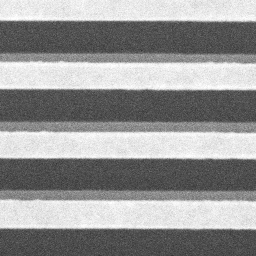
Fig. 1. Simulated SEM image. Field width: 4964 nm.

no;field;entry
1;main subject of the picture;lines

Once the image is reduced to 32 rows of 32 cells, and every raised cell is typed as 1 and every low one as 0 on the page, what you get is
11111111111111111111111111111111
11111111111111111111111111111111
11111111111111111111111111111111
00000000000000000000000000000000
00000000000000000000000000000000
00000000000000000000000000000000
00000000000000000000000000000000
11111111111111111111111111111111
11111111111111111111111111111111
11111111111111111111111111111111
11111111111111111111111111111111
00000000000000000000000000000000
00000000000000000000000000000000
00000000000000000000000000000000
00000000000000000000000000000000
11111111111111111111111111111111
11111111111111111111111111111111
11111111111111111111111111111111
11111111111111111111111111111111
11111111111111111111111111111111
00000000000000000000000000000000
00000000000000000000000000000000
00000000000000000000000000000000
00000000000000000000000000000000
11111111111111111111111111111111
11111111111111111111111111111111
11111111111111111111111111111111
11111111111111111111111111111111
11111111111111111111111111111111
00000000000000000000000000000000
00000000000000000000000000000000
00000000000000000000000000000000